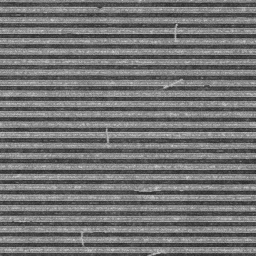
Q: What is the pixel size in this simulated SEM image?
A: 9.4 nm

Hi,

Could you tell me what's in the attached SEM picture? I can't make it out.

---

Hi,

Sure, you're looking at parallel lines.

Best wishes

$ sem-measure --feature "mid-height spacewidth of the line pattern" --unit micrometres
0.0482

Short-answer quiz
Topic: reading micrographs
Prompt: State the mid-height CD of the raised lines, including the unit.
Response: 55.2 nm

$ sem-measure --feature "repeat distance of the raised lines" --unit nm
98.1